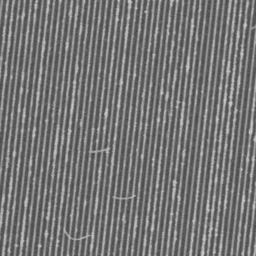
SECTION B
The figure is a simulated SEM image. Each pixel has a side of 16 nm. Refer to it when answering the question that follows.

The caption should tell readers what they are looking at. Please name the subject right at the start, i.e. parallel lines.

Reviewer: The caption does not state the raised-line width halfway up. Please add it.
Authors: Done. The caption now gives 31.8 nm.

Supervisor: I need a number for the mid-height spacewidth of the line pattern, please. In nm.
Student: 63.4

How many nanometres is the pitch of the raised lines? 92.9